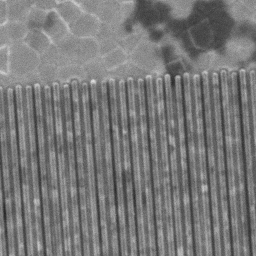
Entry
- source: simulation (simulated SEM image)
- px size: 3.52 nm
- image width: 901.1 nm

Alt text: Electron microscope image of parallel lines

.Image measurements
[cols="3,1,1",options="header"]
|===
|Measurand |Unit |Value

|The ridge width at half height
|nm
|17.1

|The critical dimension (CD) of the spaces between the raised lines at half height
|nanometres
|17.1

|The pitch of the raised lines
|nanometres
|32.9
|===